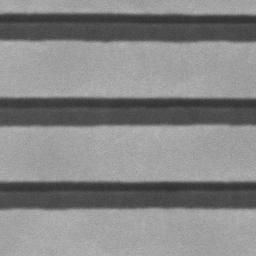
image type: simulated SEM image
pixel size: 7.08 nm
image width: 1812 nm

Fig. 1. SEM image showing lines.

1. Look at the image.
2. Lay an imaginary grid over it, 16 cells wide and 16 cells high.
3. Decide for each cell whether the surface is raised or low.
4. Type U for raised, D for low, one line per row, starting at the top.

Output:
UUUUUUUUUUUUUUUU
DDDDDDDDDDDDDDDD
DDDDDDDDDDDDDDDD
UUUUUUUUUUUUUUUU
UUUUUUUUUUUUUUUU
UUUUUUUUUUUUUUUU
DDDDDDDDDDDDDDDD
DDDDDDDDDDDDDDDD
UUUUUUUUUUUUUUUU
UUUUUUUUUUUUUUUU
UUUUUUUUUUUUUUUU
DDDDDDDDDDDDDDDD
DDDDDDDDDDDDDDDD
UUUUUUUUUUUUUUUU
UUUUUUUUUUUUUUUU
UUUUUUUUUUUUUUUU